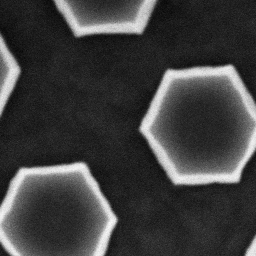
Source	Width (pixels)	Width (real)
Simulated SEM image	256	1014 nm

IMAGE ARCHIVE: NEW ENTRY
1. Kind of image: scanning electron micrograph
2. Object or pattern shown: raised bodies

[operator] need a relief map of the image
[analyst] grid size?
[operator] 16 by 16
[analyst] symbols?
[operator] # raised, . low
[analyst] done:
....#####.......
.....####.......
................
#...............
#...........##..
#.........#####.
..........######
.........#######
.........#######
..........######
....#......####.
.#####..........
.#####..........
#######.........
#######.........
.#####..........